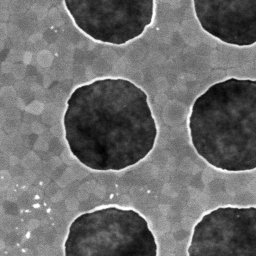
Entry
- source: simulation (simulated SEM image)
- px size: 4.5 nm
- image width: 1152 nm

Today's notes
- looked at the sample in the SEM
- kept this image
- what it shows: holes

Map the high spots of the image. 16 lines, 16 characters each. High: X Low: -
XXXX------XX----
XXXXX----XXXX---
XXXXXX--XXXXXX--
XXXXXXXXXXXXXXXX
XXXXXXXXXXXXXXXX
XXXXX----XXXX---
XXXX-----XXX----
XXXX------XX----
XXXX------XX----
XXXXX----XXX----
XXXXXX--XXXXXX--
XXXXXXXXXXXXXXXX
XXXXXXXXXXXXXXXX
XXXXX----XXXX---
XXXX-----XXX----
XXXX------XX----